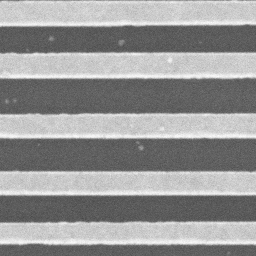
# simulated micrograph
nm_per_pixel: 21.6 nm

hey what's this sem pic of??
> lines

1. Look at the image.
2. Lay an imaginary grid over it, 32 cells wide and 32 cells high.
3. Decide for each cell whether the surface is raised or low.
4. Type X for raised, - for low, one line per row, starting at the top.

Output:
XXXXXXXXXXXXXXXXXXXXXXXXXXXXXXXX
XXXXXXXXXXXXXXXXXXXXXXXXXXXXXXXX
XXXXXXXXXXXXXXXXXXXXXXXXXXXXXXXX
--------------------------------
--------------------------------
--------------------------------
--------------------------------
XXXXXXXXXXXXXXXXXXXXXXXXXXXXXXXX
XXXXXXXXXXXXXXXXXXXXXXXXXXXXXXXX
XXXXXXXXXXXXXXXXXXXXXXXXXXXXXXXX
--------------------------------
--------------------------------
--------------------------------
--------------------------------
XXXXXXXXXXXXXXXXXXXXXXXXXXXXXXXX
XXXXXXXXXXXXXXXXXXXXXXXXXXXXXXXX
XXXXXXXXXXXXXXXXXXXXXXXXXXXXXXXX
--------------------------------
--------------------------------
--------------------------------
--------------------------------
-X------------------------------
XXXXXXXXXXXXXXXXXXXXXXXXXXXXXXXX
XXXXXXXXXXXXXXXXXXXXXXXXXXXXXXXX
--------------------------------
--------------------------------
--------------------------------
--------------------------------
XXXXXXXXXXXXXXXXXXXXXXXXXXXXXXXX
XXXXXXXXXXXXXXXXXXXXXXXXXXXXXXXX
--------------------------------
--------------------------------